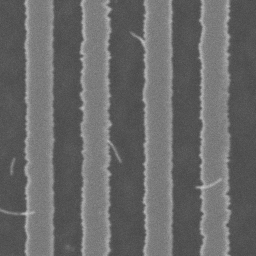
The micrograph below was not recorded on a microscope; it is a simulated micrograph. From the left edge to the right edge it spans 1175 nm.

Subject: lines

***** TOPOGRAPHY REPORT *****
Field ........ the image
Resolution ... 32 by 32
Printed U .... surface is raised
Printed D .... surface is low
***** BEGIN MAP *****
DDDUUUUDDDUUUUDDDDUUUDDDDUUUUDDD
DDDUUUUDDDUUUUDDDDUUUDDDDUUUUDDD
DDDUUUUDDDUUUUDDDDUUUDDDDUUUDDDD
DDDUUUUDDDUUUUDDDDUUUDDDDUUUDDDD
DDDUUUUDDDUUUUDDDDUUUDDDDUUUUDDD
DDDUUUUDDDUUUUDDDDUUUDDDDUUUUDDD
DDDUUUUDDDUUUUDDDDUUUDDDDUUUDDDD
DDDUUUUDDDUUUUDDDDUUUDDDDUUUDDDD
DDDUUUUDDDUUUUDDDDUUUDDDDUUUDDDD
DDDUUUUDDDUUUDDDDDUUUDDDDUUUUDDD
DDDUUUUDDDUUUUDDDDUUUDDDDUUUUDDD
DDDUUUUDDDUUUUDDDDUUUDDDDUUUDDDD
DDDUUUUDDDUUUUDDDDUUUDDDDUUUDDDD
DDDUUUUDDDUUUUDDDDUUUDDDDUUUDDDD
DDDUUUUDDDUUUUDDDDUUUDDDDUUUDDDD
DDDUUUUDDDUUUUDDDDUUUDDDDUUUDDDD
DDDUUUUDDDUUUUDDDDUUUDDDDUUUDDDD
DDDUUUUDDDUUUUDDDDUUUDDDDUUUUDDD
DDDUUUUDDDUUUUDDDDUUUDDDDUUUUDDD
DDDUUUUDDDUUUUDDDDUUUDDDDUUUDDDD
DDDUUUUDDDUUUUDDDDUUUDDDDUUUDDDD
DDDUUUUDDDUUUUDDDDUUUDDDDUUUDDDD
DDDUUUUDDDUUUUDDDDUUUDDDDUUUDDDD
DDDUUUUDDDUUUUDDDDUUUDDDDUUUUDDD
DDDUUUUDDDUUUUDDDDUUUDDDDUUUDDDD
DDDUUUUDDDUUUUDDDDUUUUDDDUUUUDDD
DDDUUUUDDDUUUDDDDDUUUDDDDUUUUDDD
DDDUUUUDDDUUUUDDDDUUUDDDDUUUDDDD
DDDUUUUDDDUUUUDDDDUUUDDDDUUUDDDD
DDDUUUUDDDUUUUDDDDUUUDDDDUUUUDDD
DDDUUUUDDDUUUUDDDDUUUDDDDUUUUDDD
DDDUUUUDDDUUUUDDDDUUUDDDDUUUUDDD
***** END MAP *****